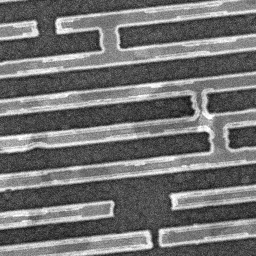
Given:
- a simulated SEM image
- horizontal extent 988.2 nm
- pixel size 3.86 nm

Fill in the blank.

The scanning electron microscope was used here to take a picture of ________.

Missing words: parallel lines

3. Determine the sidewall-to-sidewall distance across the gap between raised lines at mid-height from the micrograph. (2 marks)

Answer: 90.7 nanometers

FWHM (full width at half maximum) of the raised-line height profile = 53.3 nm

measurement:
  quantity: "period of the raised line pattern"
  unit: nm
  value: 144